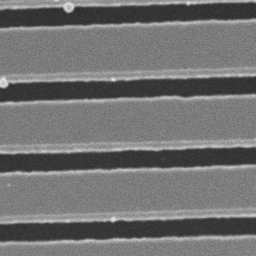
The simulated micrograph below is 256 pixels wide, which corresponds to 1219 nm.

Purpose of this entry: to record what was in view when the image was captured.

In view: lines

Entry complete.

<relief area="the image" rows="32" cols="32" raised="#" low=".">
###################.#...........
........#.......................
...............................#
..##############################
################################
################################
################################
################################
################################
################################
#...............................
................................
..........######################
################################
################################
################################
################################
################################
########################........
................................
................................
........########################
################################
################################
################################
################################
################################
###################.............
................................
................................
################################
################################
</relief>